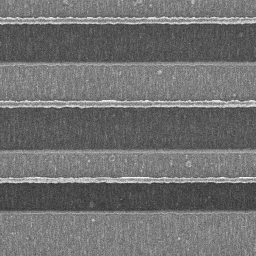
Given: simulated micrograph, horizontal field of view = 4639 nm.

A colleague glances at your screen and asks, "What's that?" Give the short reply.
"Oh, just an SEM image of lines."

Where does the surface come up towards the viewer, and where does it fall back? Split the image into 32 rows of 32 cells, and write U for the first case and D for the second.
UUUUUUUUUUUUUUUUUUUUUUUUUUUUUUUU
UUUUUUUUUUUUUUUUUUUUUUUUUUUUUUUU
UUUUUUUUUUUUUUUUUUUUUUUUUUUUUUUU
DDDDDDDDDDDDDDDDDDDDDDDDDDDDDDDD
DDDDDDDDDDDDDDDDDDDDDDDDDDDDDDDD
DDDDDDDDDDDDDDDDDDDDDDDDDDDDDDDD
DDDDDDDDDDDDDDDDDDDDDDDDDDDDDDDD
DDDDDDDDDDDDDDDDDDDDDDDDDDDDDDDD
UUUUUUUUUUUUUUUUUUUUUUUUUUUUUUUU
UUUUUUUUUUUUUUUUUUUUUUUUUUUUUUUU
UUUUUUUUUUUUUUUUUUUUUUUUUUUUUUUU
UUUUUUUUUUUUUUUUUUUUUUUUUUUUUUUU
UUUUUUUUUUUUUUUUUUUUUUUUUUUUUUUU
DDDDDDDDDDDDDDDDDDDDDDDDDDDDDDDD
DDDDDDDDDDDDDDDDDDDDDDDDDDDDDDDD
DDDDDDDDDDDDDDDDDDDDDDDDDDDDDDDD
DDDDDDDDDDDDDDDDDDDDDDDDDDDDDDDD
DDDDDDDDDDDDDDDDDDDDDDDDDDDDDDDD
DDDDDDDDDDDDDDDDDDDDDDDDDDDDDDDD
UUUUUUUUUUUUUUUUUUUUUUUUUUUUUUUU
UUUUUUUUUUUUUUUUUUUUUUUUUUUUUUUU
UUUUUUUUUUUUUUUUUUUUUUUUUUUUUUUU
UUUUUUUUUUUUUUUUUUUUUUUUUUUUUUUU
DDDDDDDDDDDDDDDDDDDDDDDDDDDDDDDD
DDDDDDDDDDDDDDDDDDDDDDDDDDDDDDDD
DDDDDDDDDDDDDDDDDDDDDDDDDDDDDDDD
DDDDDDDDDDDDDDDDDDDDDDDDDDDDDDDD
UUUUUUUUUUUUUUUUUUUUUUUUUUUUUUUU
UUUUUUUUUUUUUUUUUUUUUUUUUUUUUUUU
UUUUUUUUUUUUUUUUUUUUUUUUUUUUUUUU
UUUUUUUUUUUUUUUUUUUUUUUUUUUUUUUU
UUUUUUUUUUUUUUUUUUUUUUUUUUUUUUUU